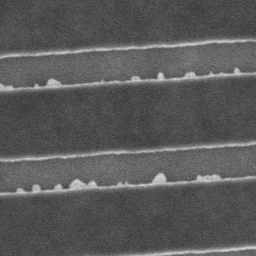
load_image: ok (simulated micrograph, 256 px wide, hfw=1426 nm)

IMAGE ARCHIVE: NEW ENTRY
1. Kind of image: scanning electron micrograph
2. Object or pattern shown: lines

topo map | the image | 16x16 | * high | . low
****************
****************
****************
**..............
................
..**************
****************
****************
****************
*********.......
................
.........*******
****************
****************
****************
****************